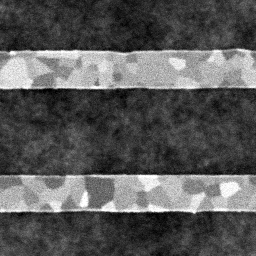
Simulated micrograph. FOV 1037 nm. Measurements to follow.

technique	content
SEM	one or a few lines or trenches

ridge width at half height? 147 nanometres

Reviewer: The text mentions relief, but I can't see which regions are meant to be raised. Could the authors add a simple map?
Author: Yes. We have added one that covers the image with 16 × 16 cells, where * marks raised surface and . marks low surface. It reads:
................
................
................
****************
****************
...*......**....
................
................
................
................
................
****************
****************
................
................
................